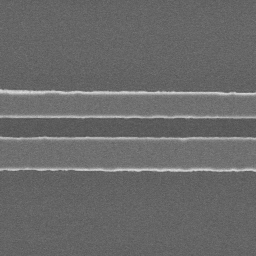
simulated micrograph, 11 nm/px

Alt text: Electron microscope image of lines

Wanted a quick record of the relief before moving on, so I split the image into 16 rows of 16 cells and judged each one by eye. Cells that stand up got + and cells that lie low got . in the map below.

................
................
................
................
................
................
++++++++++++++++
++++++++++++++++
++++++++++++++++
++++++++++++++++
++++++++++++++++
................
................
................
................
................